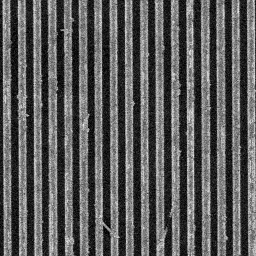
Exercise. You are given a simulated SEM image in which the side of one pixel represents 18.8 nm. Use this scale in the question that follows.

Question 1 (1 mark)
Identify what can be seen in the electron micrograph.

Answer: parallel lines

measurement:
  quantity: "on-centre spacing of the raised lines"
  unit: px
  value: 15.3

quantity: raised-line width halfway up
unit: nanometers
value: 110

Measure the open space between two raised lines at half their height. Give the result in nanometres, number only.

164